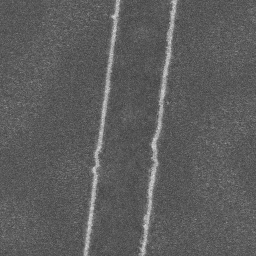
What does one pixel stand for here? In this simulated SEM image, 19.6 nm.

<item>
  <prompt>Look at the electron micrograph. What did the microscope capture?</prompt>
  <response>one or a few lines or trenches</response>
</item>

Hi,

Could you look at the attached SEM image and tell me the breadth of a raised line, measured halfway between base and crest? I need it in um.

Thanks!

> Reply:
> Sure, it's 1.1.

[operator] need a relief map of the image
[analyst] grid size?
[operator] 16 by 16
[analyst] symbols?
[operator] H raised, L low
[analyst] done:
LLLLLLLHHHHLLLLL
LLLLLLLHHHHLLLLL
LLLLLLLHHHHLLLLL
LLLLLLLHHHHLLLLL
LLLLLLLHHHLLLLLL
LLLLLLLHHHLLLLLL
LLLLLLLHHHLLLLLL
LLLLLLHHHHLLLLLL
LLLLLLHHHHLLLLLL
LLLLLLHHHHLLLLLL
LLLLLLHHHHLLLLLL
LLLLLLHHHLLLLLLL
LLLLLLHHHLLLLLLL
LLLLLLHHHLLLLLLL
LLLLLLHHHLLLLLLL
LLLLLHHHHLLLLLLL